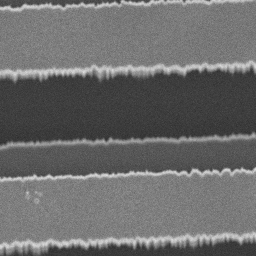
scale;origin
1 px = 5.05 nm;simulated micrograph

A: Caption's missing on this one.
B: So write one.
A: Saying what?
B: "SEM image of lines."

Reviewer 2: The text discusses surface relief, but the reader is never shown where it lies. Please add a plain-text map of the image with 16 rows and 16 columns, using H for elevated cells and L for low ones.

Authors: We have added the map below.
HHHHHHHHHHHHHHHH
HHHHHHHHHHHHHHHH
HHHHHHHHHHHHHHHH
HHHHHHHHHHHHHHHH
HHHHHLLLLLLLLLLL
LLLLLLLLLLLLLLLL
LLLLLLLLLLLLLLLL
LLLLLLLLLLLLLLLL
LLLLLLLLLLLLLLLL
HHHHHHHHHHHHHHHH
HHHHHHHHHHHHHHHH
HHHHHHHHHHHHHHHH
HHHHHHHHHHHHHHHH
HHHHHHHHHHHHHHHH
HHHHHHHHHHHHHHHH
LLLLLLLLLLLLLLLL